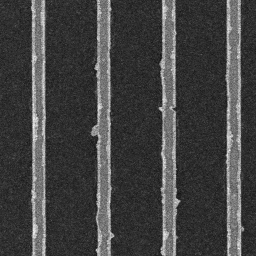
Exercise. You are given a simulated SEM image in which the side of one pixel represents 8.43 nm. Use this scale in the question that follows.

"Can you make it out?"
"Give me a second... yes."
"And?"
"one or a few lines or trenches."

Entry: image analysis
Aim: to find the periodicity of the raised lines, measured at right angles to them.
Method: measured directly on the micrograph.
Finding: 549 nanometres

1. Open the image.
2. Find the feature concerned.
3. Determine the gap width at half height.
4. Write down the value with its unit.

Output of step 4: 52.6 px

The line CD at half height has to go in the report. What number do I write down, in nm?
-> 98